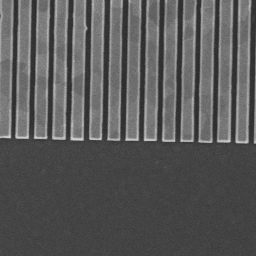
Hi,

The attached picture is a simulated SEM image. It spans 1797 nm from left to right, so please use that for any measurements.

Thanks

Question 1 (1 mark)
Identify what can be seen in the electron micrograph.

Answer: parallel lines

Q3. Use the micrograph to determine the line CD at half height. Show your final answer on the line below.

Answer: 84.3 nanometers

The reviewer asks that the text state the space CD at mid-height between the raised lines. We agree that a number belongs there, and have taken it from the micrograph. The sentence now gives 42.1 nanometres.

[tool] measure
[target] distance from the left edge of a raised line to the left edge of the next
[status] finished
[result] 128 nm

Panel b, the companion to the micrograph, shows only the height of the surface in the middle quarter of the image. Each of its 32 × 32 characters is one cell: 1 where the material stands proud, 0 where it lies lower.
00111001110011001110011001110011
00111001110111001110011001110011
00111001110111001110011001110011
00111001110111001110011001110011
00111001110111001110011001110011
00111001110111001110111001110011
00111001110111001110111001110011
00111001100111001110111001110011
00111001100111001110111001110011
00111001100111001110111001110011
00111001100111001110111001110011
00111001100111001110111001110011
00111001100111001110111001110011
00111001100111001110111001110011
00111001100111001110111001110111
00111001100111001100111001110111
00111001100111001110111001110111
00111001100111001100111001100111
00111001100111001100111001100111
00000000000000000000000000000000
00000000000000000000000000000000
00000000000000000000000000000000
00000000000000000000000000000000
00000000000000000000000000000000
00000000000000000000000000000000
00000000000000000000000000000000
00000000000000000000000000000000
00000000000000000000000000000000
00000000000000000000000000000000
00000000000000000000000000000000
00000000000000000000000000000000
00000000000000000000000000000000